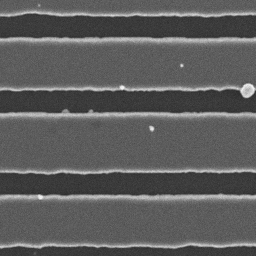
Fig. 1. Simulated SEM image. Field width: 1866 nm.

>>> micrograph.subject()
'lines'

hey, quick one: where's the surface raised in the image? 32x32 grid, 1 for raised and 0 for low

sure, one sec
11111111111111111111111111111111
11111111111111111111111111111111
00000000000000000000000000000000
00000000000000000000000000000000
00000000000000000000000000000000
11111111111111111111111111111111
11111111111111111111111111111111
11111111111111111111111111111111
11111111111111111111111111111111
11111111111111111111111111111111
11111111111111111111111111111111
00000000000000000000000000000011
00000000000000000000000000000000
00000000000000000000000000000000
11111111111111111111111111111111
11111111111111111111111111111111
11111111111111111111111111111111
11111111111111111111111111111111
11111111111111111111111111111111
11111111111111111111111111111111
11111111111111111111111111111111
11111111111111011111111111111111
00000000000000000000000000000000
00000000000000000000000000000000
11111011001110010000000111111010
11111111111111111111111111111111
11111111111111111111111111111111
11111111111111111111111111111111
11111111111111111111111111111111
11111111111111111111111111111111
11111111111111111111111111111111
00000000000000000000000000000000